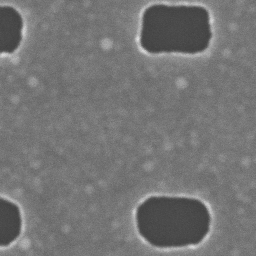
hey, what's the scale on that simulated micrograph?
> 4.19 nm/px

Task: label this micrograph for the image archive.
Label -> holes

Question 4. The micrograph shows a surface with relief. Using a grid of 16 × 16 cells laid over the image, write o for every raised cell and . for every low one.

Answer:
.oooooooo....ooo
.oooooooo....ooo
.oooooooo....ooo
oooooooooooooooo
oooooooooooooooo
oooooooooooooooo
oooooooooooooooo
oooooooooooooooo
oooooooooooooooo
oooooooooooooooo
oooooooooooooooo
oooooooooooooooo
ooooooooo...oooo
.oooooooo....ooo
.oooooooo....ooo
oooooooooooooooo